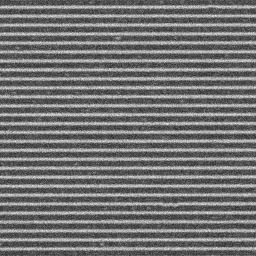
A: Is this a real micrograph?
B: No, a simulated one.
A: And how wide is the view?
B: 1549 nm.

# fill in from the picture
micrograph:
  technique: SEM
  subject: parallel lines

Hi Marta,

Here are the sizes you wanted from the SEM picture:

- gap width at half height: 37.8 nm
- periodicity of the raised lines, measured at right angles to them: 54.2 nanometres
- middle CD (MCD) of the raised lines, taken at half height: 0.0159 um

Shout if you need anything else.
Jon